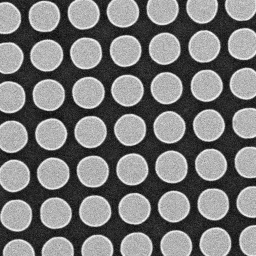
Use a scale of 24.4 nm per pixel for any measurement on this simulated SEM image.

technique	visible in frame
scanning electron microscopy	an array of small figures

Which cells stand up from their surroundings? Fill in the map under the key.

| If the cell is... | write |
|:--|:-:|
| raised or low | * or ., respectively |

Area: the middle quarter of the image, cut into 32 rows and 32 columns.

...*****......**................
................................
........................***.....
.....***......****.....******...
...******...*******...*******...
...*******..********..*******...
..********..********..*******...
..********..********..*******...
..********...******....******...
...******....*****......***.....
....****.......*................
................................
........................****....
.....****.....*****....******...
....******...*******...*******..
...*******...*******...*******..
*..*******...*******...*******..
*..********..*******...*******..
...*******...*******...******...
....******....*****......***....
.....****.......................
................................
.................*.......****...
.....****.....******...*******..
....******....******...********.
*..********..********..********.
*..********..********..********.
*..********..********..********.
*...*******...******....******..
*...******.....****.......***...
......***.......................
................................